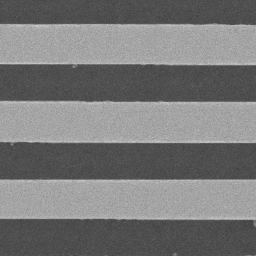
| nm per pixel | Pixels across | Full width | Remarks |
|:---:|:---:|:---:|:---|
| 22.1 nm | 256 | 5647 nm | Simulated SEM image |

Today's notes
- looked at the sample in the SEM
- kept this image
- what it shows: lines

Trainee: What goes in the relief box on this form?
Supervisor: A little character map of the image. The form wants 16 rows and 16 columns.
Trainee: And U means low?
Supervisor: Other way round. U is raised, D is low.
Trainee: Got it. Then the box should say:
DDDDDDDDDDDDDDDD
DDDDDDDDDDDDDDDD
UUUUUUUUUUUUUUUU
UUUUUUUUUUUUUUUU
DDDDDDDDDDDDDDDD
DDDDDDDDDDDDDDDD
UUUUUUUUUUUUUUUU
UUUUUUUUUUUUUUUU
UUUUUUUUUUUUUUUU
DDDDDDDDDDDDDDDD
DDDDDDDDDDDDDDDD
UUUUUUUUUUUUUUUU
UUUUUUUUUUUUUUUU
UUUUUUUUUUUUUUUU
DDDDDDDDDDDDDDDD
DDDDDDDDDDDDDDDD